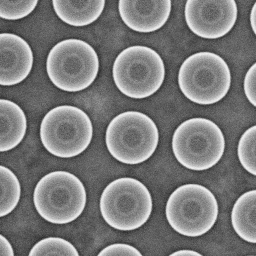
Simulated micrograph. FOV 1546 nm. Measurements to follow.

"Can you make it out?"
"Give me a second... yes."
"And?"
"an array of small figures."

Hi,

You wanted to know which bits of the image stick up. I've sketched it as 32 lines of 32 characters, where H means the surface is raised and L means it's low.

HHHHHLLHHHHHHLLHHHHHHLLHHHHHHLLL
HHHHLLLHHHHHHLLHHHHHHLLHHHHHHHLH
LLLLLLLLHHHHLLLHHHHHHLLHHHHHHLLH
LLLLLLLLLLLLLLLLHHHHLLLLHHHHHLLL
HHLLLLLLLLLLLLLLLLLLLLLLLHHHLLLL
HHHLLLLHHHHLLLLLLLLLLLLLLLLLLLLL
HHHHLLHHHHHHLLLHHHHLLLLLLLLLLLLL
HHHHLLHHHHHHLLHHHHHHLLLHHHHHLLLL
HHHHLLHHHHHHLLHHHHHHLLLHHHHHLLLH
HHHLLLHHHHHHLLHHHHHHLLHHHHHHHLLH
HHLLLLLHHHHLLLLHHHHHLLHHHHHHHLLH
LLLLLLLLLLLLLLLHHHHLLLLHHHHHLLLH
LLLLLLLLLLLLLLLLLLLLLLLLHHHLLLLH
HHLLLLLHHHLLLLLLLLLLLLLLLLLLLLLL
HHHLLLHHHHHLLLLHHHLLLLLLLLLLLLLL
HHHLLHHHHHHLLLHHHHHLLLLHHHHLLLLL
HHHLLHHHHHHLLHHHHHHHLLHHHHHHLLLH
HHHLLHHHHHHLLHHHHHHHLLHHHHHHLLHH
HLLLLLHHHHHLLLHHHHHLLLHHHHHHLLHH
LLLLLLLHHLLLLLHHHHHLLLHHHHHHLLHH
LLLLLLLLLLLLLLLLLLLLLLLHHHHLLLHH
HLLLLLLHLLLLLLLLLLLLLLLLLLLLLLLH
HHLLLHHHHHLLLLLHHLLLLLLLLLLLLLLL
HHLLHHHHHHLLLHHHHHLLLLHHHHLLLLLL
HHLLHHHHHHHLLHHHHHHLLHHHHHHLLLHH
HHLLHHHHHHHLLHHHHHHLLHHHHHHLLHHH
HLLLLHHHHHLLLHHHHHHLLHHHHHHLLHHH
LLLLLLHHHLLLLHHHHHLLLHHHHHHLLHHH
LLLLLLLLLLLLLLLHHLLLLLHHHHLLLHHH
LLLLLLLLLLLLLLLLLLLLLLLLLLLLLLHH
HLLLLHHHHLLLLLLLLLLLLLLLLLLLLLLL
HHLLHHHHHHLLLHHHHLLLLLHHLLLLLLLL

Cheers